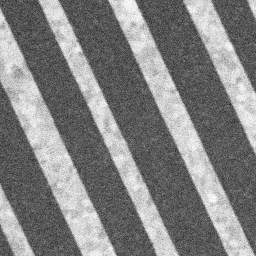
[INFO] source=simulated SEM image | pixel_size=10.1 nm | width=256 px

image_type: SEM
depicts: one or a few lines or trenches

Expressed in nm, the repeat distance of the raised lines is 655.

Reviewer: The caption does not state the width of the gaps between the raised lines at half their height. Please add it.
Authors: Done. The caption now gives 450 nm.